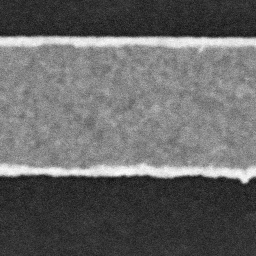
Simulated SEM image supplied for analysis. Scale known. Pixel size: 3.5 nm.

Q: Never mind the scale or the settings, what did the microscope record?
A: one or a few lines or trenches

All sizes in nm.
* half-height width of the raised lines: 458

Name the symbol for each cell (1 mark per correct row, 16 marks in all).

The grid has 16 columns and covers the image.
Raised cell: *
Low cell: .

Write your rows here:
................
................
................
****************
****************
****************
****************
****************
****************
****************
****************
................
................
................
................
................